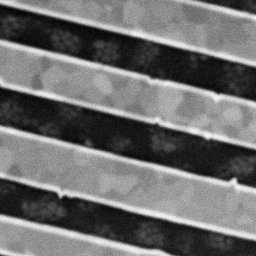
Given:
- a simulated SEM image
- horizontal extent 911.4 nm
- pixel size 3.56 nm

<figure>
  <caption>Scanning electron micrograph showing one or a few lines or trenches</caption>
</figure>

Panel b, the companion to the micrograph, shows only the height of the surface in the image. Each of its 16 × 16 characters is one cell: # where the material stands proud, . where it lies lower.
..############..
......##########
..........######
####..........##
########........
.###########....
.....###########
.........#######
##...........###
######..........
##########......
..#############.
......##########
..........######
####..........##
########........